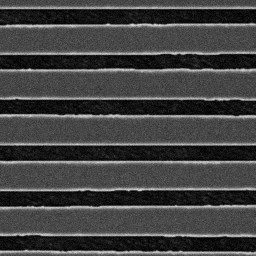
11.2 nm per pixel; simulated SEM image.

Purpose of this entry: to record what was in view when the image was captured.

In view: lines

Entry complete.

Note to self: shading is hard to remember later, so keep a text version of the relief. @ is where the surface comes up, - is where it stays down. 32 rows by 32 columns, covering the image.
@@@@@@@@@@@@@@@@@@@@@@@@@@@@@@@@
--------------------------------
--------------------------------
@@@@@@@@@@@@@@@@@@@@@@@@@@@@@@@@
@@@@@@@@@@@@@@@@@@@@@@@@@@@@@@@@
@@@@@@@@@@@@@@@@@@@@@@@@@@@@@@@@
@@@@@@@@@@@@@@@@@@@@@@@@@@@@@@@@
--------------------------------
--------------------------------
@@@@@@@@@@@@@@@@@@@@@@@@@@@@@@@@
@@@@@@@@@@@@@@@@@@@@@@@@@@@@@@@@
@@@@@@@@@@@@@@@@@@@@@@@@@@@@@@@@
--------------------------------
--------------------------------
@@@@@@@@@@@@@@@@@@@@@@@@@@@@@-@@
@@@@@@@@@@@@@@@@@@@@@@@@@@@@@@@@
@@@@@@@@@@@@@@@@@@@@@@@@@@@@@@@@
@@@@@@@@@@@@@@@@@@@@@@@@@@@@@@@@
--------------------------------
--------------------------------
@@@@@@@@@@@@@@@@@@@@@@@@@@@@@@@@
@@@@@@@@@@@@@@@@@@@@@@@@@@@@@@@@
@@@@@@@@@@@@@@@@@@@@@@@@@@@@@@@@
@@@@@@@@@@@@@@@@@@@@@@@@@@@@@@@@
--------------------------------
--------------------------------
@@@@@@@@@@@@@@@@@@@@@@@@@@@@@@@@
@@@@@@@@@@@@@@@@@@@@@@@@@@@@@@@@
@@@@@@@@@@@@@@@@@@@@@@@@@@@@@@@@
---------------------@-@@@@@@@@@
--------------------------------
@@@@@@@@@@@@@@@--@--------------